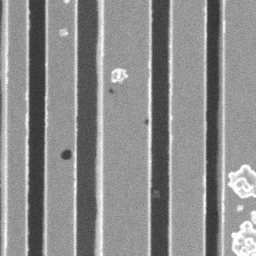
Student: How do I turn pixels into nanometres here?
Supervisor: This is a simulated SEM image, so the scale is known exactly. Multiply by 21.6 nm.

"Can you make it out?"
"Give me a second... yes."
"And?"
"lines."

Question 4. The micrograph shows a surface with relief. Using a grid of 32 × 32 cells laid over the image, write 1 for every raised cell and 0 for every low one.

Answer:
01110011110001111110011111001111
01110011110001111110011111001111
01110011100001111110011111001111
01110011110001111110011111001111
01110011110001111110011111001111
01110011110001111110011111001111
01110011100001111110011111001111
01110011100001111110011111001111
01110011100001111110011111001111
01100011100001111110011111001111
01100011100001111110011111001111
01100011100001111110011111001111
01100011100001111110011111001111
01100011100001111110011111001111
01100011100001111110011111001111
01100011100001111110011111001111
01100011100001111110011111001111
01100011100001111110011111001111
01100011100001111110011111001111
01100011100001111110011111001111
01100011100001111110011111001111
01100011100001111110011111001111
01100011100001111110011111001111
01100011100001111110011111001111
01100011100001111110011111001111
01100011100001111110011111001111
01100011100001111110011111001111
01100011100001111110011111001111
01100011100001111110011111001111
01100011100001111110011111001111
01100011100001111110011111001111
01100011100001111110011111001111